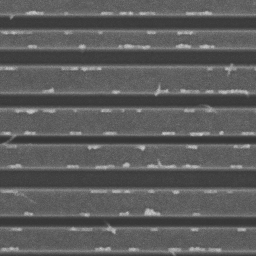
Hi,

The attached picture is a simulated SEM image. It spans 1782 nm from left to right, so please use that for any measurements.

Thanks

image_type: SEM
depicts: parallel lines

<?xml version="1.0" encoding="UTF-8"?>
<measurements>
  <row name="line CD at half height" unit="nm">205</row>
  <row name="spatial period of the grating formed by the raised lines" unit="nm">278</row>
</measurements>